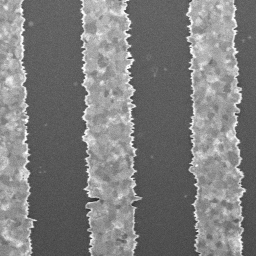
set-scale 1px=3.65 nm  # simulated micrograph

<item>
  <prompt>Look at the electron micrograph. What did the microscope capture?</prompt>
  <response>one or a few lines or trenches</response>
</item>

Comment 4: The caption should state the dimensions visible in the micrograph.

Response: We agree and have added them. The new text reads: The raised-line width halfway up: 0.166 µm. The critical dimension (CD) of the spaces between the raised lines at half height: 222 nm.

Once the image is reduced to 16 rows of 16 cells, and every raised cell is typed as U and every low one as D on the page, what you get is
UDDDDUUUDDDDUUUD
UDDDDUUUDDDDUUUD
UDDDDUUUDDDDUUUD
UDDDDUUUDDDDUUUD
UUDDDUUUDDDDUUUD
UUDDDUUUDDDDUUUD
UUDDDUUUDDDDUUUD
UUDDDUUUDDDDUUUD
UUDDDUUUDDDDUUUD
UUDDDUUUDDDDUUUD
UUDDDDUUDDDDUUUD
UUDDDUUUDDDDUUUD
UUDDDDUUDDDDUUUD
UUDDDDUUDDDDUUUD
UUDDDDUUDDDDUUUD
UUDDDDUUDDDDUUUD